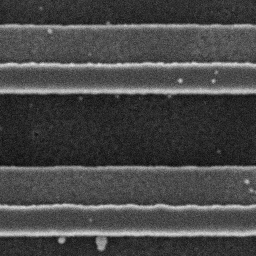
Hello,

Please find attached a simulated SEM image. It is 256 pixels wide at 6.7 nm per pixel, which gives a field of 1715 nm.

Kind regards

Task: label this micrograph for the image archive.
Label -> lines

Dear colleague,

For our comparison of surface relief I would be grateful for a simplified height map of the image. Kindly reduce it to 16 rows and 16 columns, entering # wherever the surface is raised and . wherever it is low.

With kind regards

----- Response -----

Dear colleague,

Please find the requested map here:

................
................
################
################
################
################
................
................
................
................
################
################
################
################
################
................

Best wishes